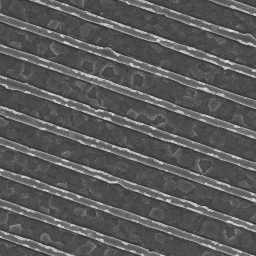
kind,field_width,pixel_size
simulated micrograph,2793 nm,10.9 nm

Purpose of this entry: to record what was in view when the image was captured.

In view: parallel lines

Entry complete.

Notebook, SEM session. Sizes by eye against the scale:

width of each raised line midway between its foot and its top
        78.7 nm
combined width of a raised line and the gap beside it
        29.3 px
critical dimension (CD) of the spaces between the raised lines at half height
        234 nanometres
